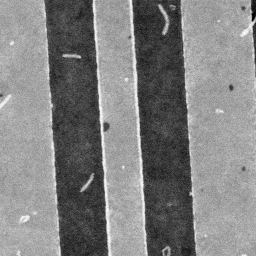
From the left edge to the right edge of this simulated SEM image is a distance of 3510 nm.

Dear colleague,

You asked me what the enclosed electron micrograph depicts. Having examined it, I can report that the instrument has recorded lines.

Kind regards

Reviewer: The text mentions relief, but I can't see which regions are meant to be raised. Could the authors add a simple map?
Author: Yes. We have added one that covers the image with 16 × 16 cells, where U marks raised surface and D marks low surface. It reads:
UUUDDDUUDDDUUUUU
UUUDDDUUDDDUUUUU
UUUDDDUUDDDUUUUU
UUUDDDUUDDDDUUUU
UUUDDDUUDDDDUUUU
UUUDDDUUUDDDUUUU
UUUDDDUUUDDDUUUU
UUUDDDUUUDDDUUUU
UUUDDDUUUDDDUUUU
UUUDDDUUUDDDUUUU
UUUDDDUUUDDDUUUU
UUUDDDDUUDDDUUUU
UUUUDDDUUDDDUUUU
UUUUDDDUUDDDUUUU
UUUUDDDUUDDDUUUU
UUUUDDDUUDDDUUUU